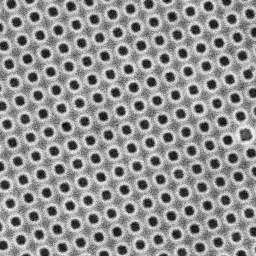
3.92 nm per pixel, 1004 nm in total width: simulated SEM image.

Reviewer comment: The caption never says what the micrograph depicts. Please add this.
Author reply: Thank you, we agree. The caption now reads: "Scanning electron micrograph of a regular array of holes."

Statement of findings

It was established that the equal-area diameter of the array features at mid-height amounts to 44 nm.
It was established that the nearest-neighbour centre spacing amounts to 0.0734 microns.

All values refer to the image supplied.